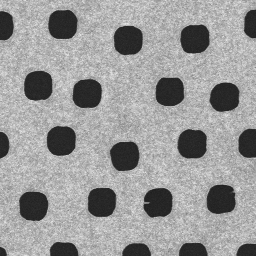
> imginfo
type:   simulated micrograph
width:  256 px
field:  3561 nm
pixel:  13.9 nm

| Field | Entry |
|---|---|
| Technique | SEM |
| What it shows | a regular array of holes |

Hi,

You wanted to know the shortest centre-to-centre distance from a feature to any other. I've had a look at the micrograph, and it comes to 778 nm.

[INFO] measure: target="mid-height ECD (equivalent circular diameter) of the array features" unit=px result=30.2